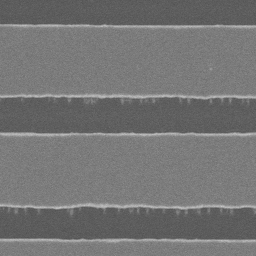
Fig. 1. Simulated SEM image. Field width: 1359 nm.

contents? lines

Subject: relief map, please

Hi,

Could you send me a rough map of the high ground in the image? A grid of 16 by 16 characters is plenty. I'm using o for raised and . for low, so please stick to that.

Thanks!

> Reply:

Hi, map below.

................
................
oooooooooooooooo
oooooooooooooooo
oooooooooooooooo
oooooooooooooooo
................
................
oooooooooooooooo
oooooooooooooooo
oooooooooooooooo
oooooooooooooooo
oooooooooooooooo
................
................
oooooooooooooooo